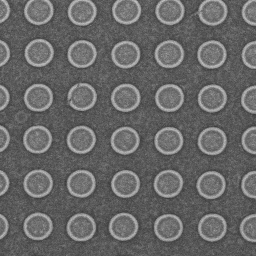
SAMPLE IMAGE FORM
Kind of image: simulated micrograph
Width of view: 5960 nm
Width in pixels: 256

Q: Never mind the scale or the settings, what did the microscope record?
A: a regular array of raised bodies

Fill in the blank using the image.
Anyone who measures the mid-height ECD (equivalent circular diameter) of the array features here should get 26.2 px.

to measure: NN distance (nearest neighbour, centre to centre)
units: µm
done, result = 0.995